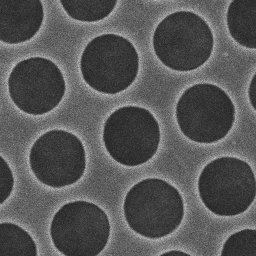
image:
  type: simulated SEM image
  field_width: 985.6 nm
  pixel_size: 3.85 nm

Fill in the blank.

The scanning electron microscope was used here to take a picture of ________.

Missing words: holes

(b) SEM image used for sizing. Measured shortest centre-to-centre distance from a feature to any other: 75.4 pixels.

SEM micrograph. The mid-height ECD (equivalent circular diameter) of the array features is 227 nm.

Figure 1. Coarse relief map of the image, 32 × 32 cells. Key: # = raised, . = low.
.....###......###############...
.....###......########..####....
.....#####..########.....###....
.....###############......###...
....########...####........##...
###########.....###........###..
##########.......##.......######
###...####.......###......######
##.....###.......####....#######
#.......##.......###############
#.......###.....#########.#####.
#.......#####..########.....###.
##......##############.......##.
##.....########...####.......###
##############.....###.......###
#############.......##.......###
######..#####.......###......###
#####.....###.......####...#####
####......###.......############
####.......###.....#############
.###.......####...########.....#
.###......###############.......
..###.....########..#####.......
..##############......###.......
.###############.......##.......
########....####.......###.....#
#######......###.......####...##
#######.......##.......#########
...###........##......##########
....##........####...########...
....###......###############....
.....###.....########..#####....